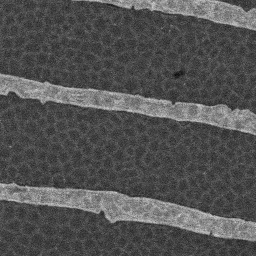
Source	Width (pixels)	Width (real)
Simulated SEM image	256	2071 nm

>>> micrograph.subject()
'one or a few lines or trenches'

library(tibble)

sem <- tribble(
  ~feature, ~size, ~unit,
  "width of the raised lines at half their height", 135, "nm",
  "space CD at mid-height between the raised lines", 0.707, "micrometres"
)